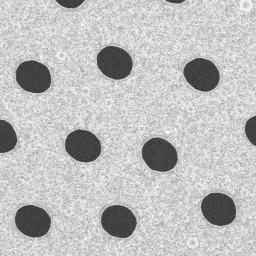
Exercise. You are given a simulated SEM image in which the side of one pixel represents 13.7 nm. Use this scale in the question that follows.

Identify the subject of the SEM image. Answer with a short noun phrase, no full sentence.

a regular array of holes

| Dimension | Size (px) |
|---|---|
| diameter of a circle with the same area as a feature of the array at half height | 34.4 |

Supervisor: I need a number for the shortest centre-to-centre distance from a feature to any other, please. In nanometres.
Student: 1110